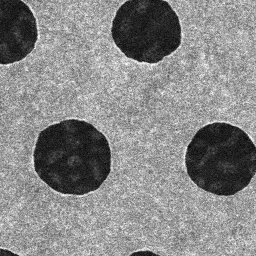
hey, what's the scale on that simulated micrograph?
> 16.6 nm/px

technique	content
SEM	holes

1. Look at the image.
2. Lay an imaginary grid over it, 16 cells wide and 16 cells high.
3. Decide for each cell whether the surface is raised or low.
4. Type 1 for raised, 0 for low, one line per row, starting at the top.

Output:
0011111000011111
0011111000011111
0011111000011111
0011111100111111
1111111111111111
1111111111111111
1111111111111111
1111011111111111
1100000111110000
1100000111110000
1100000111110000
1110001111110000
1111111111111111
1111111111111111
1111111111111111
1111111111111111